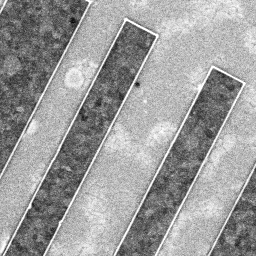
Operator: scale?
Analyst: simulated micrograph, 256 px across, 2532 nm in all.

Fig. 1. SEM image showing one or a few lines or trenches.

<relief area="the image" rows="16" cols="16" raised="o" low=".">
ooooo...........
ooooo...........
oooo...ooo......
oooo...oo.......
ooo...ooo....o..
ooo...oo.....oo.
oo...ooo....ooo.
oo...oo.....oo..
o...ooo....ooo..
o...oo.....oo...
...ooo....ooo...
...oo....ooo...o
..ooo....ooo...o
..oo....ooo...oo
.ooo....oo....oo
.oo....ooo...ooo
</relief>